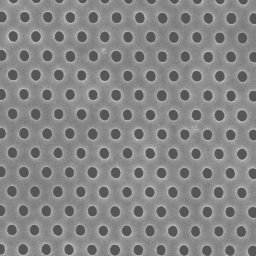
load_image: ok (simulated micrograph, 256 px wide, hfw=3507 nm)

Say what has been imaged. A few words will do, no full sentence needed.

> a regular array of holes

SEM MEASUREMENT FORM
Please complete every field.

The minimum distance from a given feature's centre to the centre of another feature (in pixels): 22.2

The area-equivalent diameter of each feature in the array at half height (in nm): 140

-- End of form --